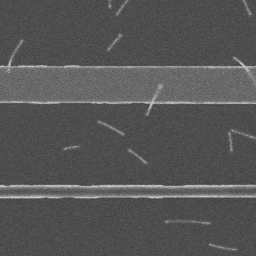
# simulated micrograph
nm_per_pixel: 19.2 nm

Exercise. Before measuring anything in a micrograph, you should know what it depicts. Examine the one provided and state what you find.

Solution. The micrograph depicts lines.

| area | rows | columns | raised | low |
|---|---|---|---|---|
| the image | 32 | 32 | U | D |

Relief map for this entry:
DDDDDDDDDDDDDDDDDDDDDDDDDDDDDDDD
DDDDDDDDDDDDDDDDDDDDDDDDDDDDDDDD
DDDDDDDDDDDDDDDDDDDDDDDDDDDDDDDD
DDDDDDDDDDDDDDDDDDDDDDDDDDDDDDDD
DDDDDDDDDDDDDDDDDDDDDDDDDDDDDDDD
DDDDDDDDDDDDDDDDDDDDDDDDDDDDDDDD
DDDDDDDDDDDDDDDDDDDDDDDDDDDDDDDD
DDDDDDDDDDDDDDDDDDDDDDDDDDDDDDDD
UUUUUUUUUUUUUUUUUUUUUUUUUUUUUUUU
UUUUUUUUUUUUUUUUUUUUUUUUUUUUUUUU
UUUUUUUUUUUUUUUUUUUUUUUUUUUUUUUU
UUUUUUUUUUUUUUUUUUUUUUUUUUUUUUUU
UUUUUUUUUUUUUUUUUUUUUUUUUUUUUUUU
DDDDDDDDDDDDDDDDDDDDDDDDDDDDDDDD
DDDDDDDDDDDDDDDDDDDDDDDDDDDDDDDD
DDDDDDDDDDDDDDDDDDDDDDDDDDDDDDDD
DDDDDDDDDDDDDDDDDDDDDDDDDDDDDDDD
DDDDDDDDDDDDDDDDDDDDDDDDDDDDDDDD
DDDDDDDDDDDDDDDDDDDDDDDDDDDDDDDD
DDDDDDDDDDDDDDDDDDDDDDDDDDDDDDDD
DDDDDDDDDDDDDDDDDDDDDDDDDDDDDDDD
DDDDDDDDDDDDDDDDDDDDDDDDDDDDDDDD
DDDDDDDDDDDDDDDDDDDDDDDDDDDDDDDD
UUUUUUUUUUUUUUUUUUUUUUUUUUUUUUUU
UUUUUUUUUUUUUUUUUUUUUUUUUUUUUUUU
DDDDDDDDDDDDDDDDDDDDDDDDDDDDDDDD
DDDDDDDDDDDDDDDDDDDDDDDDDDDDDDDD
DDDDDDDDDDDDDDDDDDDDDDDDDDDDDDDD
DDDDDDDDDDDDDDDDDDDDDDDDDDDDDDDD
DDDDDDDDDDDDDDDDDDDDDDDDDDDDDDDD
DDDDDDDDDDDDDDDDDDDDDDDDDDDDDDDD
DDDDDDDDDDDDDDDDDDDDDDDDDDDDDDDD